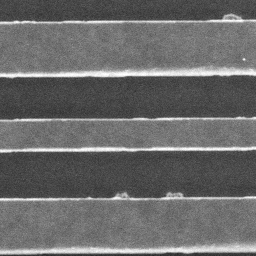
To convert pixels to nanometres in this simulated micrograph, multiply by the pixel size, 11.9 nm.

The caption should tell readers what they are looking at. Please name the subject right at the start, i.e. lines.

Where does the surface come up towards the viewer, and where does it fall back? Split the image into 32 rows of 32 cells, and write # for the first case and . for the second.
................................
................................
................................
################################
################################
################################
################################
################################
################################
#########.......................
................................
................................
................................
................................
................................
################################
################################
################################
################################
................................
................................
................................
................................
................................
................................
################################
################################
################################
################################
################################
################################
#########......##...............